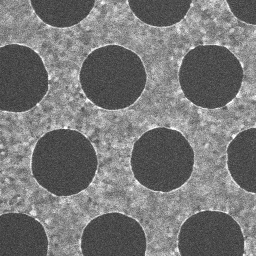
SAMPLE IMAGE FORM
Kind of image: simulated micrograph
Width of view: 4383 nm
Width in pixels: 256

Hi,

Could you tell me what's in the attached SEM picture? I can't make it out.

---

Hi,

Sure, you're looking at holes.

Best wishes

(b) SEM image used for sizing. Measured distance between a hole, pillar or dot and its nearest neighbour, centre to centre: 1650 nm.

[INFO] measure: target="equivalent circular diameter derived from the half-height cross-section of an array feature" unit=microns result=1.12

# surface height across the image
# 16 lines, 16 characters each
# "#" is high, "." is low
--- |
##....##....##..
###..####..#####
################
..###....###...#
...##....##....#
...##....##....#
..####..####..##
################
###..####..####.
##....##....##..
##....##....##..
##....###..####.
################
..####..####..##
...##....##....#
...##....##....#